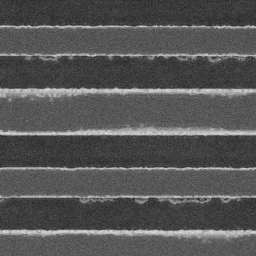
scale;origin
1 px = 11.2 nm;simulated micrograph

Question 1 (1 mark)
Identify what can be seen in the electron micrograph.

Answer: lines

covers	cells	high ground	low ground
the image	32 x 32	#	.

................................
................................
................................
################################
################################
################################
################################
................................
................................
................................
................................
################################
################################
################################
################################
################################
################################
................................
................................
................................
................................
################################
################################
################################
################################
................................
................................
................................
................................
################################
################################
################################